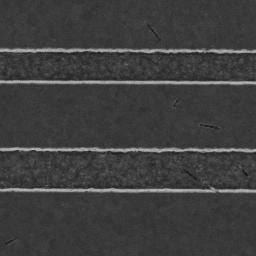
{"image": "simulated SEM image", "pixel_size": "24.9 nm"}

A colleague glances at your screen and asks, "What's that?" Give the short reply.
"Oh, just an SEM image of one or a few lines or trenches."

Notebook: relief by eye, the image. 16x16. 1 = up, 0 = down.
1111111111111111
1111111111111111
1111111111111111
0000000000000000
0000000000000000
1111111111111111
1111111111111111
1111111111111111
1111111111111111
0000000000000000
0000000000000000
0000000000000000
1111111111111111
1111111111111111
1111111111111111
1111111111111111